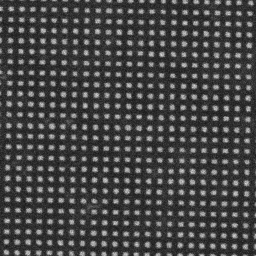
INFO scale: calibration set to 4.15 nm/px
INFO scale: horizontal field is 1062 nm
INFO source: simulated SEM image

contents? a regular array of raised bodies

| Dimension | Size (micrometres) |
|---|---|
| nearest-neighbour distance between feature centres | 0.0424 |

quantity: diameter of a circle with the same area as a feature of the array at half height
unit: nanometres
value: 21